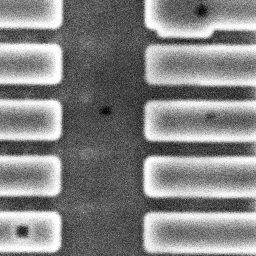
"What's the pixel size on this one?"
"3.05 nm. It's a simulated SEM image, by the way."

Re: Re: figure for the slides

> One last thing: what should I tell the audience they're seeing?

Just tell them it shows wiring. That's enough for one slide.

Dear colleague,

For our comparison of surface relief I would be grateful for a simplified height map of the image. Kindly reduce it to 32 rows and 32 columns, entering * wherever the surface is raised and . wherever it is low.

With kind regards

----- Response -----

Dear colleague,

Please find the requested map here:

********..........**************
********..........**************
********..........**************
...................*************
................................
................................
********...........*************
********...........*************
********...........*************
********...........*************
................................
................................
................................
*******...........**************
*******...........**************
*******...........**************
*******...........**************
................................
................................
................................
*******...........**************
*******...........**************
*******...........**************
*******...........**************
............................***.
................................
................................
*******...........**************
**.****...........**************
*******...........**************
*******...........**************
..........................******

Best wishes